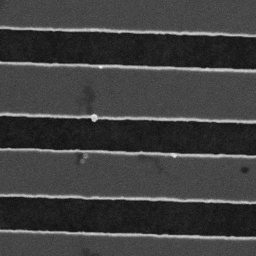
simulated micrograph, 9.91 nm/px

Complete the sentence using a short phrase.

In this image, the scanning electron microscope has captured lines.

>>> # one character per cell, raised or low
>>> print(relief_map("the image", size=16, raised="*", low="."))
****************
****************
................
................
****************
****************
****************
..........******
................
********........
****************
****************
..........******
................
*****...........
****************